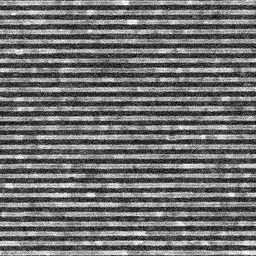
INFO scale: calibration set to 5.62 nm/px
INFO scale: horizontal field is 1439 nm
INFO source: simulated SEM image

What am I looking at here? parallel lines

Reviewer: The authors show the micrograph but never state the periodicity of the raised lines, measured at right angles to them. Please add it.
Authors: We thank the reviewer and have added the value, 54.1 nm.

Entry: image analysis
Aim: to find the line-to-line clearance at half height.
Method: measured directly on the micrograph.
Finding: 35.9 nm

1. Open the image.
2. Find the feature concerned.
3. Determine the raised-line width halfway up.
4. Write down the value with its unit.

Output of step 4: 20.4 nm